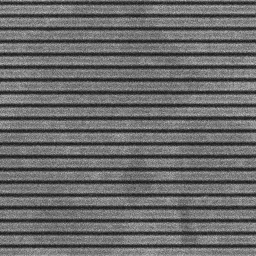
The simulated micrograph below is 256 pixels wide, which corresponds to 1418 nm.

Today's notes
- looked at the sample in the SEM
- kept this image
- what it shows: parallel lines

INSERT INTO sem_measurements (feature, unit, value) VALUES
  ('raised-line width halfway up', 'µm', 0.0436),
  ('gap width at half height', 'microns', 0.027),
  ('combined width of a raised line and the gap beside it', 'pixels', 12.8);